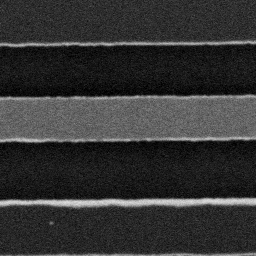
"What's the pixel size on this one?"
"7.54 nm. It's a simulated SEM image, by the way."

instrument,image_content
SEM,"lines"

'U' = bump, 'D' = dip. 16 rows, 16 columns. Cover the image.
UUUUUUUUUUUUUUUU
UUUUUUUUUUUUUUUU
UUUUUUUUUUUUUUUU
DDDDDDDDDDDDDDDD
DDDDDDDDDDDDDDDD
DDDDDDDDDDDDDDDD
UUUUUUUUUUUUUUUU
UUUUUUUUUUUUUUUU
UUUUUUUUUUUUUUUU
DDDDDDDDDDDDDDDD
DDDDDDDDDDDDDDDD
DDDDDDDDDDDDDDDD
DDDDDDDDDDDDDDDD
UUUUUUUUUUUUUUUU
UUUUUUUUUUUUUUUU
UUUUUUUUUUUUUUUU